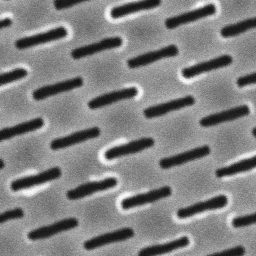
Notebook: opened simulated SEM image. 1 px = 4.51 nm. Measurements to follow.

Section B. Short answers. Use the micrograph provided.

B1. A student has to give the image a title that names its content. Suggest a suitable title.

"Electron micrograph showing a regular array of holes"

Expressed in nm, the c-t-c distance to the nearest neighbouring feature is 238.